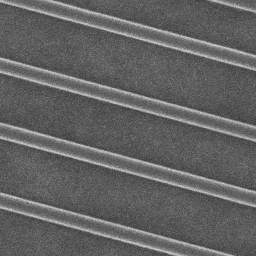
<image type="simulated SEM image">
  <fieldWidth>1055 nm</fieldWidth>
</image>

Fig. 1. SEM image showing one or a few lines or trenches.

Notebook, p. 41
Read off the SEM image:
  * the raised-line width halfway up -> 58.3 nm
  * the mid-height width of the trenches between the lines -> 221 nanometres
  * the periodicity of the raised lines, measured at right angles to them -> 272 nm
